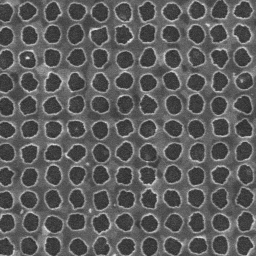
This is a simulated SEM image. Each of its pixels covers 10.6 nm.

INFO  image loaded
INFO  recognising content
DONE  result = a regular array of holes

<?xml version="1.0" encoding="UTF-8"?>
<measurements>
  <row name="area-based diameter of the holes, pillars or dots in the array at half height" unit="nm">186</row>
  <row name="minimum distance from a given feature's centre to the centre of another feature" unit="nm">240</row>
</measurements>